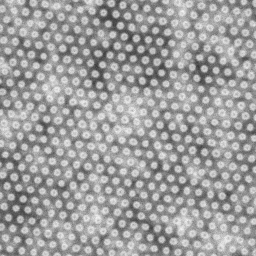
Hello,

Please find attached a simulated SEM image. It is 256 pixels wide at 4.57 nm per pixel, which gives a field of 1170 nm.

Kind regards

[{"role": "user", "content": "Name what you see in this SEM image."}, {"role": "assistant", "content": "a regular array of raised bodies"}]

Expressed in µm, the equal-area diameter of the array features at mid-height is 0.0291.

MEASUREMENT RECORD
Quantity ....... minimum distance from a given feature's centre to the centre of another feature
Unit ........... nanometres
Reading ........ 53.1